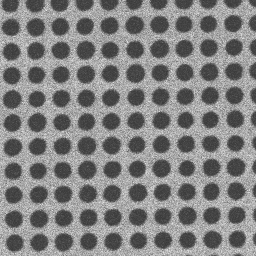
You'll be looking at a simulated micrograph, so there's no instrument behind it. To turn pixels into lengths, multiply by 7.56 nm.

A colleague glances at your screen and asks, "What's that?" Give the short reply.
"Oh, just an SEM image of a regular array of holes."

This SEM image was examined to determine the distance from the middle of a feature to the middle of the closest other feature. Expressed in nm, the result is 180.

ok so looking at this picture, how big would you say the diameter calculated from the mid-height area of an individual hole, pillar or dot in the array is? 133 nanometers